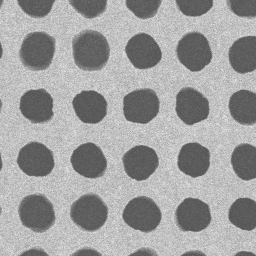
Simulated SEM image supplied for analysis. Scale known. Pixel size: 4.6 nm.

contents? a regular array of holes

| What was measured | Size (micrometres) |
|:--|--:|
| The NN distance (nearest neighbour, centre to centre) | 0.239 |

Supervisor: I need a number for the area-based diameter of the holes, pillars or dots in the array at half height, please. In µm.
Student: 0.162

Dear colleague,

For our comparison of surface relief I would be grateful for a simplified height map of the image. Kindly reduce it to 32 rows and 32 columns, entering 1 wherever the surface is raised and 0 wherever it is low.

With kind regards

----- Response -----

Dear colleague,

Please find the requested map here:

11000001100001110000110000011000
11100011110001111000111000111000
11111111111111111111111111111111
11111111111111111111111111111111
11100011110001111001111001111110
11100001100000110000110000111000
11100001100000110000110000111000
11100011100001110000110000111000
11110011110001111011111001111000
11111111111111111111111111111111
11111111111111111111111111111111
11100011110011110001110001111001
11100001100001100000110000111000
11100001100001100000110000111000
11100011110001110001110000111000
11111111111111111111111011111111
11111111111111111111111111111111
11111111111111111111111111111111
11100011110011110001111000111100
11000001100001110000110000111000
11000001100001100000110000111000
11100011110001110001111000111000
11111111111111111111111111111111
11111111111111111111111111111111
11100111110011111111111111111111
11100011100001110001111000111000
11000001100001100000110000111000
11100001100001100000110000111000
11110011110011111001111000111100
11111111111111111111111111111111
11111111111111111111111111111111
11100111110011111001111101111101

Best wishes